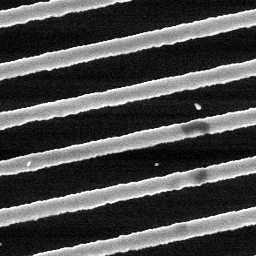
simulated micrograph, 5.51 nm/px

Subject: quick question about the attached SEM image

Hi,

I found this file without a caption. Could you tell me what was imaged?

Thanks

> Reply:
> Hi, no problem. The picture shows lines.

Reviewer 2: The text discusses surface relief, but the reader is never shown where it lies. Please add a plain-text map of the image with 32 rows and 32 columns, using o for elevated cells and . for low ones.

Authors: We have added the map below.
....oooooooooo..................
ooooooooo.....................oo
oooo.....................ooooooo
.....................ooooooooo..
................oooooooooo......
............oooooooooo..........
.......ooooooooo................
..ooooooooo....................o
ooooooo....................ooooo
oo....................ooooooooo.
.................oooooooooo.....
.............ooooooooo..........
.......oooooooooo...............
...ooooooooo....................
oooooooo...................ooooo
ooo...................oooooooooo
.................ooooooooooo....
............oooooooooo..........
........ooooooooo...............
...ooooooooo....................
oooooooo....................oooo
ooo....................ooooooooo
..................ooooooooo.....
.............oooooooooo.........
........oooooooooo..............
....ooooooooo...................
oooooooo.....................ooo
ooo.....................oooooooo
....................oooooooooo..
...............oooooooooo.......
..........oooooooooo............
......ooooooooo.................